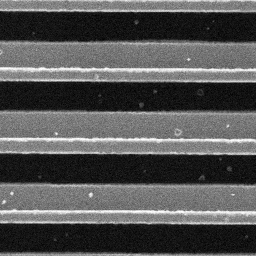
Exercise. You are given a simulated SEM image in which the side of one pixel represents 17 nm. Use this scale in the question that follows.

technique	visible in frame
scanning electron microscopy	lines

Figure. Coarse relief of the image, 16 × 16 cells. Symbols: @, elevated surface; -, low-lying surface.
@@@@@@@@@@@@@@@@
----------------
----------------
@@@@@@@@@@@@@@@@
@@@@@@@@@@@@@@@@
----------------
----------------
@@@@@@@@@@@@@@@@
@@@@@@@@@@@@@@@@
@@@@@@@@@@@@@@@@
----------------
----------------
@@@@@@@@@@@@@@@@
@@@@@@@@@@@@@@@@
----------------
----------------